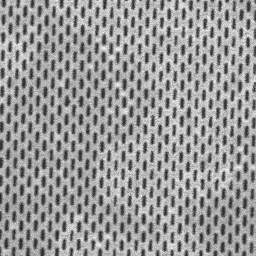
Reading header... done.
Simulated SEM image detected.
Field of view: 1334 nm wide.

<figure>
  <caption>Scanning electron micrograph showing a regular array of holes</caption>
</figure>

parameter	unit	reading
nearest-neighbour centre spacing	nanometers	57.5